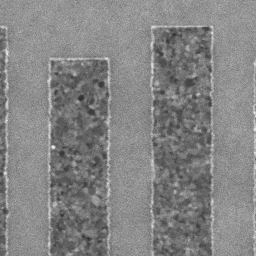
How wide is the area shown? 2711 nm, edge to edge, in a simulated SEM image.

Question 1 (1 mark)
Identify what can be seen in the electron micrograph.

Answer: one or a few lines or trenches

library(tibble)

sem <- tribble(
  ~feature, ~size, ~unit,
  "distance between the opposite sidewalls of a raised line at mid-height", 624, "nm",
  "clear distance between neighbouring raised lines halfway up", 458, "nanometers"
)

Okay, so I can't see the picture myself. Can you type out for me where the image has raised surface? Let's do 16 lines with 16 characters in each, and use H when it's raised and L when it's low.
LLLLLLLLLLLLLLLL
LLLLLLLLLLLLLLLL
LLLLLLLLLLHHHLLL
LLLLLLLLLLHHHLLL
LLLHHHHLLLHHHLLL
LLLHHHHLLLHHHLLL
LLLHHHHLLLHHHLLL
LLLHHHHLLLHHHLLL
LLLHHHHLLHHHHLLL
LLLHHHHLLLHHHLLL
LLLHHHHLLLHHHLLL
LLLHHHHLLLHHHLLL
LLLHHHHLLLHHHLLL
LLLHHHHLLLHHHLLL
LLLHHHHLLLHHHLLL
LLLHHHHLLLHHHLLL